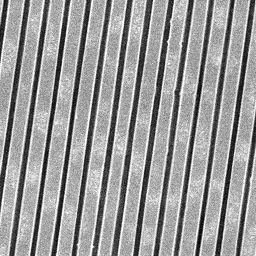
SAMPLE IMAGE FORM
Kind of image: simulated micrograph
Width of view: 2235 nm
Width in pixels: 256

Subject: parallel lines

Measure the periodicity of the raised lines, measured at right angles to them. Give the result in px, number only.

20.3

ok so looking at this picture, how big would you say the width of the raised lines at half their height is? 129 nm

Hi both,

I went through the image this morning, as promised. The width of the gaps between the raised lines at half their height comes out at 51.8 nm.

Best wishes